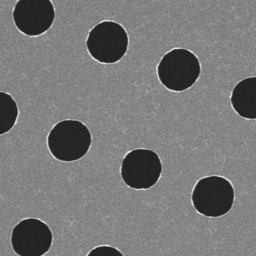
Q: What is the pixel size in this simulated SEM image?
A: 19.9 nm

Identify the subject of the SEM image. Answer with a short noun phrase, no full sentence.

holes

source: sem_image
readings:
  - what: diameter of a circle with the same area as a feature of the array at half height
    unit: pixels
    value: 41.6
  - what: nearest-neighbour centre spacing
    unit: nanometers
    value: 1540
